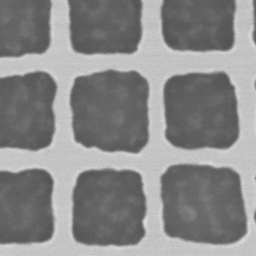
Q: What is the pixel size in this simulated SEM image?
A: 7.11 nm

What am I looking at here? holes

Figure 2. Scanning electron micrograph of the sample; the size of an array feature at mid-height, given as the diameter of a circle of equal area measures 602 nm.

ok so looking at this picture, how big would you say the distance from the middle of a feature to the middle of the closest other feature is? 0.651 um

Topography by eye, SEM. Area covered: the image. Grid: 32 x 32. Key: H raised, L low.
LLLLLLHHLLLLLLLLLLHHLLLLLLLLLLHH
LLLLLLHHHLLLLLLLLLHHLLLLLLLLLHHH
LLLLLLHHHLLLLLLLLLHHLLLLLLLLLHHH
LLLLLLHHHLLLLLLLLLHHLLLLLLLLLHHH
LLLLLLHHHLLLLLLLLLHHLLLLLLLLLHHH
LLLLLLHHHLLLLLLLLHHHHLLLLLLLLHHH
LLLLLLHHHHLLLLLLLHHHHHHHHHHHHHHH
HHHHHHHHHHHHHHHHHHHHHHHHHHHHHHHH
HHHHHHHHHHHHHHHHHHHHHHHHHHHHHHHH
HLLLLLHHHHLLLLLLLLHHHHLLLLLLLHHH
LLLLLLLHHLLLLLLLLLLHHLLLLLLLLHHH
LLLLLLLHHLLLLLLLLLLHLLLLLLLLLHHH
LLLLLLLHHLLLLLLLLLLHLLLLLLLLLLHH
LLLLLLLHHLLLLLLLLLLHHLLLLLLLLLHH
LLLLLLLHHLLLLLLLLLLHHLLLLLLLLLHH
LLLLLLLHHLLLLLLLLLLHHLLLLLLLLLHH
LLLLLLLHHLLLLLLLLLLHHLLLLLLLLLHH
LLLLLLLHHLLLLLLLLLLHHLLLLLLLLLHH
HLLLLLHHHHHHLLLLLLHHHHLLLLLLLHHH
HHHHHHHHHHHHHHHHHHHHHHHHHHHHHHHH
HHHHHHHHHHHHHHHHHHHHHHLLHHHHHHHH
LLLLLLHHHHLLLLLLLHHHHLLLLLLLLLHH
LLLLLLLHHHLLLLLLLLHHLLLLLLLLLLHH
LLLLLLLHHLLLLLLLLLHHLLLLLLLLLLHH
LLLLLLLHHLLLLLLLLLHHLLLLLLLLLLHH
LLLLLLLHHLLLLLLLLLHHLLLLLLLLLLLH
LLLLLLLHHLLLLLLLLLHHLLLLLLLLLLLH
LLLLLLLHHLLLLLLLLLHHLLLLLLLLLLLH
LLLLLLLHHLLLLLLLLLHHLLLLLLLLLLLH
LLLLLLLHHLLLLLLLLLHHHLLLLLLLLLLH
LHLHHHHHHHLLLLLLLHHHHHHHHHLLLHHH
HHHHHHHHHHHHHHHHHHHHHHHHHHHHHHHH